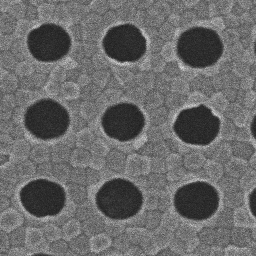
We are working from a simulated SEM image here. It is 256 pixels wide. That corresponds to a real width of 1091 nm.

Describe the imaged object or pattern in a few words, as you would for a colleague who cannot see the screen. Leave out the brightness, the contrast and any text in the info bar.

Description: a regular array of holes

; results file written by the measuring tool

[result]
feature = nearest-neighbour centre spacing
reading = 320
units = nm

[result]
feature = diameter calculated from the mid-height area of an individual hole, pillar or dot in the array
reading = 177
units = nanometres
